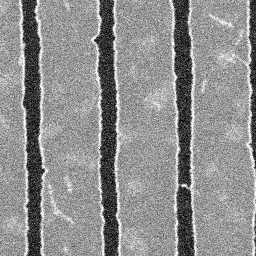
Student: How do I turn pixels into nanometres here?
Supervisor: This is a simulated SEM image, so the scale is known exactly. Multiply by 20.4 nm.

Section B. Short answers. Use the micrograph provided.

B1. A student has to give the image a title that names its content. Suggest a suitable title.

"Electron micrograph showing one or a few lines or trenches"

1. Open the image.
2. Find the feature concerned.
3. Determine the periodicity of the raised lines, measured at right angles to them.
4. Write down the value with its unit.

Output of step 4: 1540 nanometres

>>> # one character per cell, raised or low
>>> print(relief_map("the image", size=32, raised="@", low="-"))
@@@--@@@@@@@--@@@@@@@@--@@@@@@@-
@@@--@@@@@@@--@@@@@@@@--@@@@@@@-
@@@--@@@@@@@--@@@@@@@@--@@@@@@@-
@@@--@@@@@@@--@@@@@@@@--@@@@@@@-
@@@--@@@@@@@--@@@@@@@@--@@@@@@@-
@@@--@@@@@@@--@@@@@@@@--@@@@@@@-
@@@--@@@@@@@--@@@@@@@@--@@@@@@@-
@@@--@@@@@@@--@@@@@@@@--@@@@@@@-
@@@--@@@@@@@--@@@@@@@@--@@@@@@@-
@@@--@@@@@@@---@@@@@@@--@@@@@@@-
@@@--@@@@@@@---@@@@@@@--@@@@@@@-
@@@--@@@@@@@@--@@@@@@@--@@@@@@@-
@@@--@@@@@@@---@@@@@@@--@@@@@@@-
@@@--@@@@@@@---@@@@@@@--@@@@@@@-
@@@--@@@@@@@@--@@@@@@@--@@@@@@@-
@@@--@@@@@@@@--@@@@@@@--@@@@@@@-
@@@--@@@@@@@@--@@@@@@@--@@@@@@@-
@@@--@@@@@@@---@@@@@@@--@@@@@@@-
@@@--@@@@@@@---@@@@@@@--@@@@@@@-
@@@--@@@@@@@---@@@@@@@--@@@@@@@-
@@@--@@@@@@@---@@@@@@@--@@@@@@@@
@@@---@@@@@@--@@@@@@@@--@@@@@@@@
@@@--@@@@@@@---@@@@@@@--@@@@@@@@
@@@--@@@@@@@---@@@@@@@--@@@@@@@@
@@@--@@@@@@@@--@@@@@@@--@@@@@@@@
@@@--@@@@@@@@--@@@@@@@--@@@@@@@@
@@@--@@@@@@@@--@@@@@@@--@@@@@@@@
@@@--@@@@@@@@--@@@@@@@--@@@@@@@@
@@@--@@@@@@@@--@@@@@@@--@@@@@@@@
@@@--@@@@@@@@--@@@@@@@--@@@@@@@@
@@@--@@@@@@@@--@@@@@@@--@@@@@@@@
@@@--@@@@@@@@--@@@@@@@--@@@@@@@@